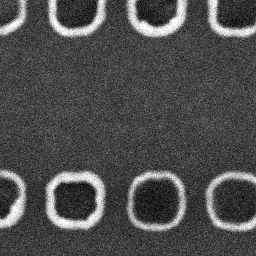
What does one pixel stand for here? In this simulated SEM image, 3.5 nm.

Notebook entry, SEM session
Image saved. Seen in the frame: raised bodies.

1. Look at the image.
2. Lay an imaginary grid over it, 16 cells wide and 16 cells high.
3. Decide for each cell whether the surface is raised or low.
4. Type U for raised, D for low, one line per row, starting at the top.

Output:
UDDUUUDDUUUDDUUU
UDDUUUDDUUUDDUUU
DDDDDDDDDDDDDDDD
DDDDDDDDDDDDDDDD
DDDDDDDDDDDDDDDD
DDDDDDDDDDDDDDDD
DDDDDDDDDDDDDDDD
DDDDDDDDDDDDDDDD
DDDDDDDDDDDDDDDD
DDDDDDDDDDDDDDDD
DDDDDDDDDDDDDDDD
UDDUUUDDUUUDDUUU
UDDUUUDDUUUDDUUU
UDDUUUDDUUUDDUUU
DDDDDDDDDDDDDDDD
DDDDDDDDDDDDDDDD